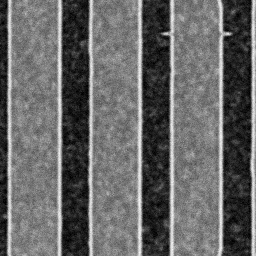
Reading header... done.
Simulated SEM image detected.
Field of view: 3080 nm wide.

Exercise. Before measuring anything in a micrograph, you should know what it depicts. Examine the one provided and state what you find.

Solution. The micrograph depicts one or a few lines or trenches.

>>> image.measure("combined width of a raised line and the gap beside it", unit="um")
0.973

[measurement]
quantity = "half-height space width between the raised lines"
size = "378 nm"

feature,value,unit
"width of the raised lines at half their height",0.599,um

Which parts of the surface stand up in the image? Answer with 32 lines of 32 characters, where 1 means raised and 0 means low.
01111110000111111000011111100000
01111110000111111000011111110000
01111110000111111000011111110000
01111110000111111000011111110000
01111110000111111000011111110000
01111110000111111000001111110000
01111110000111111000001111110000
01111110000111111000001111110000
01111110000111111000001111110000
01111110000111111000001111110000
01111110000111111000011111110000
01111110000111111000011111110000
01111110000111111000011111110000
01111110000111111000011111110000
01111111000111111000011111110000
01111110000111111000011111110000
01111110000111111000011111110000
01111110000111111000001111110000
01111110000111111000011111110000
01111110000111111000011111110000
01111110000111111000011111110000
01111110000111111000001111110000
01111110000111111000001111110000
01111110000111111000001111110000
01111110000111111000011111110000
01111110000111111000011111110000
01111110000111111000001111110000
01111111000111111000011111110000
01111111000111111000001111110000
01111110000111111000011111110000
01111110000111111000011111110000
01111110000111111000011111100000